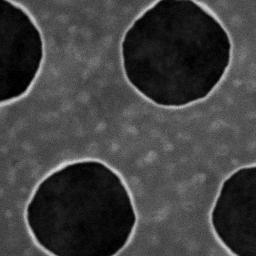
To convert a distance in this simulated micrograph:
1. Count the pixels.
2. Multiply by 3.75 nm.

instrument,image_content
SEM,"holes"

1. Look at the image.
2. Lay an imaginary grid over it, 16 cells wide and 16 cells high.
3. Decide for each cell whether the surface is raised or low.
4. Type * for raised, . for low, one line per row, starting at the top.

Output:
.********....***
..******......**
...*****......**
...*****......**
..******......**
..*******....***
**********..****
****************
****************
****************
****...********.
***.....******..
**......******..
**......*****...
**......*****...
***.....******..